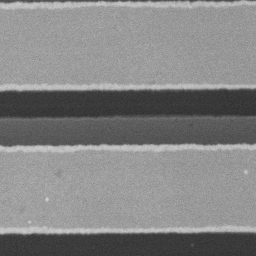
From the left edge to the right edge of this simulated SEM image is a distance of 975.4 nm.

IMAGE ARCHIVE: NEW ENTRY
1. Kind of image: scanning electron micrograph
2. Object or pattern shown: lines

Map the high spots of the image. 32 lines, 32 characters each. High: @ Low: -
@@@@@@@@@@@@@@@@@@@@@@@@@@@@@@@@
@@@@@@@@@@@@@@@@@@@@@@@@@@@@@@@@
@@@@@@@@@@@@@@@@@@@@@@@@@@@@@@@@
@@@@@@@@@@@@@@@@@@@@@@@@@@@@@@@@
@@@@@@@@@@@@@@@@@@@@@@@@@@@@@@@@
@@@@@@@@@@@@@@@@@@@@@@@@@@@@@@@@
@@@@@@@@@@@@@@@@@@@@@@@@@@@@@@@@
@@@@@@@@@@@@@@@@@@@@@@@@@@@@@@@@
@@@@@@@@@@@@@@@@@@@@@@@@@@@@@@@@
@@@@@@@@@@@@@@@@@@@@@@@@@@@@@@@@
@@@@@@@@@@@@@@@@@@@@@@@@@@@@@@@@
--------------------------------
--------------------------------
--------------------------------
--------------------------------
@@@@@@@@@@@@@@@@@@@@@@@@@@@@@@@@
@@@@@@@@@@@@@@@@@@@@@@@@@@@@@@@@
@@@@@@@@@@@@@@@@@@@@@@@@@@@@@@@@
@@@@@@@@@@@@@@@@@@@@@@@@@@@@@@@@
@@@@@@@@@@@@@@@@@@@@@@@@@@@@@@@@
@@@@@@@@@@@@@@@@@@@@@@@@@@@@@@@@
@@@@@@@@@@@@@@@@@@@@@@@@@@@@@@@@
@@@@@@@@@@@@@@@@@@@@@@@@@@@@@@@@
@@@@@@@@@@@@@@@@@@@@@@@@@@@@@@@@
@@@@@@@@@@@@@@@@@@@@@@@@@@@@@@@@
@@@@@@@@@@@@@@@@@@@@@@@@@@@@@@@@
@@@@@@@@@@@@@@@@@@@@@@@@@@@@@@@@
@@@@@@@@@@@@@@@@@@@@@@@@@@@@@@@@
@@@@@@@@@@@@@@@@@@@@@@@@@@@@@@@@
--------------------------------
--------------------------------
--------------------------------